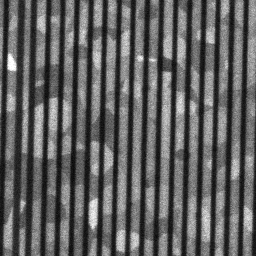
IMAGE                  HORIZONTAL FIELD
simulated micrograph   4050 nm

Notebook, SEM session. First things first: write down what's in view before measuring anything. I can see parallel lines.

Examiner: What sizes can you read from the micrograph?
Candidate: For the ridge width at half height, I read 150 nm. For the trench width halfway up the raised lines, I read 81.1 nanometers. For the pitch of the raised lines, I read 223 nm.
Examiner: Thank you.